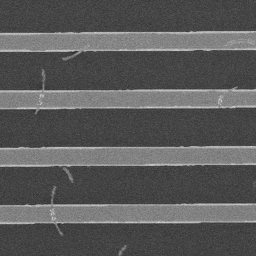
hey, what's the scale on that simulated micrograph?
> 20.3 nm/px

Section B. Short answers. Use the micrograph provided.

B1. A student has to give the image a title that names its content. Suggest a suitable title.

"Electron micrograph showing lines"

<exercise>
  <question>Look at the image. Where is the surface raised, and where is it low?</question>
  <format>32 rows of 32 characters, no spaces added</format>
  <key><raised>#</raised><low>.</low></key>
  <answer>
................................
................................
................................
................................
################################
################################
................................
................................
................................
................................
................................
################################
################################
#########.......................
................................
................................
................................
................................
......##########################
################################
################################
................................
................................
................................
................................
................................
################################
################################
................................
................................
................................
................................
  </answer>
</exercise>